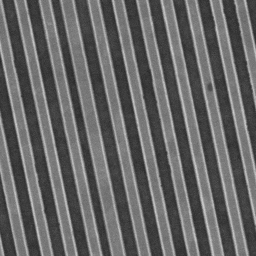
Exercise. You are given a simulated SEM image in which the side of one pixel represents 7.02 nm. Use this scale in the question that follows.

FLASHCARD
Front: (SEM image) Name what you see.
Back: parallel lines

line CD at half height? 0.0687 microns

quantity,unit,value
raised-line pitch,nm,168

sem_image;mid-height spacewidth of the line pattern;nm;104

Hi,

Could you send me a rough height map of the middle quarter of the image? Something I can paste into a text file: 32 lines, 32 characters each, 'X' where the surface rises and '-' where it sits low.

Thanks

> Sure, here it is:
---XXX---XXX----XX----XX----XX--
---XXX----XX----XX----XX----XX--
---XXX----XX----XX----XX----XXX-
---XXX----XX----XX----XXX---XXX-
X--XXX----XXX---XXX----XX----XX-
X---XXX---XXX---XXX----XX----XX-
X---XXX----XX----XX----XX----XX-
X---XXX----XX----XX----XX----XXX
X---XXX----XX----XX----XXX---XXX
XX--XXX----XXX----XX----XX----XX
XX---XXX---XXX---XXX----XX----XX
XX---XXX----XX----XX----XX----XX
XX---XXX----XX----XX----XXX---XX
XX---XXX----XX----XXX---XXX---XX
XXX--XXX----XXX----XX----XX----X
XXX---XXX---XXX----XX----XX----X
-XX---XXX----XX----XX----XX----X
-XX---XXX----XX----XX----XX----X
-XX---XXX----XX----XXX---XXX---X
-XXX--XXX----XXX----XX----XX----
-XXX---XXX---XXX----XX----XX----
--XX---XXX----XX----XX----XX----
--XX---XXX----XX----XXX---XXX---
--XX---XXX----XX----XXX---XXX---
--XXX--XXX----XXX----XX----XX---
--XXX---XXX---XXX----XX----XX---
---XX---XXX----XX----XX----XX---
---XX---XXX----XX----XX----XX---
---XX---XXX----XX----XXX---XXX--
---XXX--XXX----XXX----XX----XX--
---XXX---XXX---XXX----XX----XX--
----XX---XXX----XX----XX----XX--